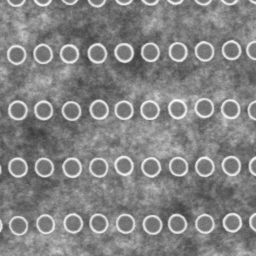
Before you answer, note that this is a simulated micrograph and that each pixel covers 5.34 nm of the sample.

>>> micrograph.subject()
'a regular array of raised bodies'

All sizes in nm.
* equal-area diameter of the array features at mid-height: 98.9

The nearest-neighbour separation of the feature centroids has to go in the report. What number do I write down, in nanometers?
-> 139